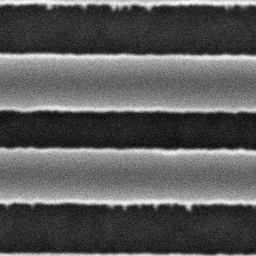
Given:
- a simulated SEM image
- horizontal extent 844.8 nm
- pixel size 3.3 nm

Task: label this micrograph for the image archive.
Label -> lines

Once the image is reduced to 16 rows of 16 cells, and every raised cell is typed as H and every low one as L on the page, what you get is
LLLLLLLLLLLLLLLL
LLLLLLLLLLLLLLLL
LLLLLLLLLLLLLLLL
HHHHHHHHHHHHLLHL
HHHHHHHHHHHHHHHH
HHHHHHHHHHHHHHHH
HHHHHHHHHHHHHHHH
LLLLLLLLLLLLLLLL
LLLLLLLLLLLLLLLL
HHHHHHHHHHHHHHHH
HHHHHHHHHHHHHHHH
HHHHHHHHHHHHHHHH
HHHHHHHHHHHHHHHH
LLLLLLLLLLLLLLLL
LLLLLLLLLLLLLLLL
LLLLLLLLLLLLLLLL